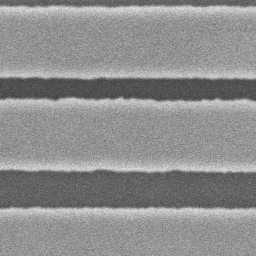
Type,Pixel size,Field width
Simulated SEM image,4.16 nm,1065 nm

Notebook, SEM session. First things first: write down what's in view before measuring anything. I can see lines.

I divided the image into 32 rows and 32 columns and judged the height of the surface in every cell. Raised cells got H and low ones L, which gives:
LLLLLLLLLLLLLLLLLLLLLLLLLLLLLLLL
HHHHHHHHHHHHHHHHHHHHHHHHHHHHHHHH
HHHHHHHHHHHHHHHHHHHHHHHHHHHHHHHH
HHHHHHHHHHHHHHHHHHHHHHHHHHHHHHHH
HHHHHHHHHHHHHHHHHHHHHHHHHHHHHHHH
HHHHHHHHHHHHHHHHHHHHHHHHHHHHHHHH
HHHHHHHHHHHHHHHHHHHHHHHHHHHHHHHH
HHHHHHHHHHHHHHHHHHHHHHHHHHHHHHHH
HHHHHHHHHHHHHHHHHHHHHHHHHHHHHHHH
HHHHHHHHHHHHHHHHHHHHHHHHHHHHHHHH
LLLLLLLLLLLLLLLLLLLLLLLLLLLLLLLL
LLLLLLLLLLLLLLLLLLLLLLLLLLLLLLLL
HHHHHHHHHHHHHHHHHHHLLLLLLHLHLHHL
HHHHHHHHHHHHHHHHHHHHHHHHHHHHHHHH
HHHHHHHHHHHHHHHHHHHHHHHHHHHHHHHH
HHHHHHHHHHHHHHHHHHHHHHHHHHHHHHHH
HHHHHHHHHHHHHHHHHHHHHHHHHHHHHHHH
HHHHHHHHHHHHHHHHHHHHHHHHHHHHHHHH
HHHHHHHHHHHHHHHHHHHHHHHHHHHHHHHH
HHHHHHHHHHHHHHHHHHHHHHHHHHHHHHHH
HHHHHHHHHHHHHHHHHHHHHHHHHHHHHHHH
LLLLLLLLLLLLLLLLLLHLLLLLLLLHLLLL
LLLLLLLLLLLLLLLLLLLLLLLLLLLLLLLL
LLLLLLLLLLLLLLLLLLLLLLLLLLLLLLLL
LLLLLLLLLLLLLLLLLLLLLLLLLLLLLLLL
LLLLLLLLLLLLLLLLLLLLLLLLLLLLLLLL
HHHHHHHHHHHHHHHHHHHHHHHHHHHHHHHH
HHHHHHHHHHHHHHHHHHHHHHHHHHHHHHHH
HHHHHHHHHHHHHHHHHHHHHHHHHHHHHHHH
HHHHHHHHHHHHHHHHHHHHHHHHHHHHHHHH
HHHHHHHHHHHHHHHHHHHHHHHHHHHHHHHH
HHHHHHHHHHHHHHHHHHHHHHHHHHHHHHHH